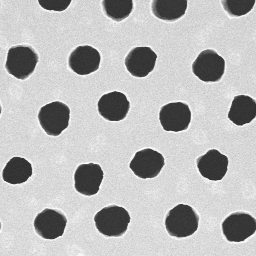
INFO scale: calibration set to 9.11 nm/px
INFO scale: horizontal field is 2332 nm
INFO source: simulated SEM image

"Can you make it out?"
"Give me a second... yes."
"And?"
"a regular array of holes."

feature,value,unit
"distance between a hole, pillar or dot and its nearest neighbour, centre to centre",521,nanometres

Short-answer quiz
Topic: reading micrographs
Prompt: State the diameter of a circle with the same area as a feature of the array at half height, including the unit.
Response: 282 nanometers